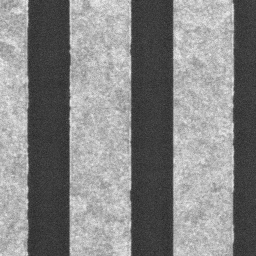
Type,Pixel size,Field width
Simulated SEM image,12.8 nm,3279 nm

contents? lines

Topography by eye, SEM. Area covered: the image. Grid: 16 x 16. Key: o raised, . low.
oo..oooo...oooo.
oo..oooo...oooo.
oo..oooo...oooo.
oo..oooo...oooo.
oo..oooo...oooo.
oo..oooo...oooo.
oo..oooo...oooo.
oo..oooo...oooo.
oo..oooo...oooo.
oo..oooo...oooo.
oo..oooo...oooo.
oo..oooo...oooo.
oo..oooo...oooo.
oo..oooo...oooo.
oo..oooo...oooo.
oo..oooo...oooo.